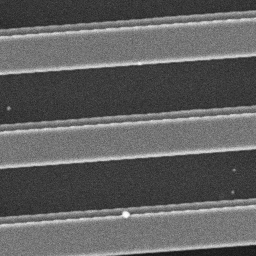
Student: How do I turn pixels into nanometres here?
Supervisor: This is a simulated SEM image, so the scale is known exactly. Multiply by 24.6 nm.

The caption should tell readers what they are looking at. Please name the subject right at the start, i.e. lines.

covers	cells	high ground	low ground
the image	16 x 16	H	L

LLLLLLLLLLLLLLLL
LLLLLHHHHHHHHHHH
HHHHHHHHHHHHHHHH
HHHHHHHHHHHHHHHH
HHLLLLLLLLLLLLLL
LLLLLLLLLLLLLLLL
LLLLLLLLLLLLLLLL
LLLLHHHHHHHHHHHH
HHHHHHHHHHHHHHHH
HHHHHHHHHHHHHHLL
HLLLLLLLLLLLLLLL
LLLLLLLLLLLLLLLL
LLLLLLLLLLLLLLLH
LHHHHHHHHHHHHHHH
HHHHHHHHHHHHHHHH
HHHHHHHHHHHHHLLL